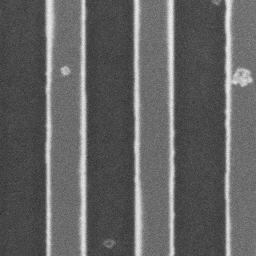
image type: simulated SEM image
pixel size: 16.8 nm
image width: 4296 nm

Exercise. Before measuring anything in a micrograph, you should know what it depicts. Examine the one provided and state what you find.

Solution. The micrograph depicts lines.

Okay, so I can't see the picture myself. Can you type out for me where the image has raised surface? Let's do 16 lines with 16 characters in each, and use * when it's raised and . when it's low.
...**...***...**
...**...***...**
...**...***...**
...**...***...**
...**...***...**
...**...***...**
...**...***...**
...**...***...**
...**...***...**
...**...***...**
...**...***...**
...**...***...**
...**....**...**
...**....**...**
...**....**...**
...**....**...**